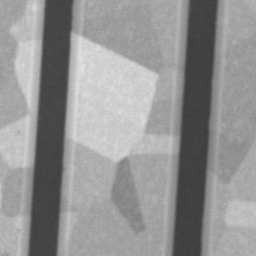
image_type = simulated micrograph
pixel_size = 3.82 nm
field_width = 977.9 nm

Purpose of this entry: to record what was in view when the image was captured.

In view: one or a few lines or trenches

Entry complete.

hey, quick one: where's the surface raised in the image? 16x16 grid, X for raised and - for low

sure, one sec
XX---XXXXXX---XX
XX---XXXXXX---XX
XX---XXXXXX---XX
XX---XXXXXX---XX
XX---XXXXXX---XX
XX---XXXXXX---XX
XX---XXXXXX---XX
XX--XXXXXXX--XXX
XX--XXXXXXX--XXX
XX--XXXXXXX--XXX
XX--XXXXXXX--XXX
XX--XXXXXXX--XXX
XX--XXXXXXX--XXX
XX--XXXXXXX--XXX
X---XXXXXXX--XXX
X---XXXXXX---XXX